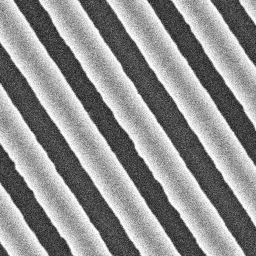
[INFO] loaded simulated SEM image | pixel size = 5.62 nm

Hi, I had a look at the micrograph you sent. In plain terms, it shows lines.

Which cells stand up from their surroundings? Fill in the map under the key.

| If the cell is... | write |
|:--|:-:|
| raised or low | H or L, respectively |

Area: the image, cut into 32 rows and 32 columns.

HHLLLHHHHHLLLLHHHHHLLLHHHHHLLLHH
HHHLLLHHHHHLLLHHHHHLLLLHHHHLLLLH
HHHLLLLHHHHLLLLHHHHHLLLHHHHHLLLL
HHHHLLLHHHHHLLLLHHHHHLLLHHHHHLLL
HHHHHLLLHHHHHLLLHHHHHLLLHHHHHLLL
HHHHHLLLHHHHHLLLLHHHHHLLLHHHHHLL
LHHHHHLLLHHHHHLLLLHHHHLLLLHHHHHL
LLHHHHHLLLHHHHHLLLHHHHHLLLHHHHHL
LLHHHHHLLLHHHHHLLLLHHHHHLLLHHHHH
LLLHHHHHLLLHHHHHLLLLHHHHLLLLHHHH
LLLLHHHHHLLLHHHHHLLLHHHHHLLLHHHH
HLLLHHHHHLLLHHHHHLLLLHHHHHLLLHHH
HLLLLHHHHHLLLHHHHHLLLLHHHHHLLLHH
HHLLLLHHHHLLLLHHHHHLLLHHHHHLLLHH
HHHLLLHHHHHLLLHHHHHLLLLHHHHHLLLH
HHHLLLLHHHHHLLLHHHHHLLLLHHHHLLLL
HHHHLLLLHHHHLLLLHHHHHLLLHHHHHLLL
HHHHHLLLHHHHHLLLLHHHHLLLLHHHHHLL
HHHHHLLLLHHHHHLLLHHHHHLLLLHHHHLL
LHHHHHLLLLHHHHLLLLHHHHLLLLHHHHHL
LLHHHHHLLLHHHHHLLLHHHHHLLLLHHHHH
LLHHHHHLLLLHHHHHLLLHHHHHLLLLHHHH
LLLHHHHHLLLLHHHHLLLLHHHHLLLLHHHH
LLLLHHHHHLLLHHHHHLLLHHHHHLLLLHHH
HLLLHHHHHLLLLHHHHHLLLHHHHHLLLLHH
HHLLLHHHHHLLLHHHHHLLLHHHHHLLLLHH
HHHLLLHHHHHLLLHHHHHLLLHHHHHLLLLH
HHHLLLHHHHHLLLLHHHHHLLLHHHHHLLLL
HHHHLLLHHHHHLLLHHHHHLLLLHHHHLLLL
HHHHLLLLHHHHHLLLHHHHHLLLHHHHHLLL
HHHHHLLLHHHHHLLLLHHHHHLLLHHHHHLL
LHHHHHLLLHHHHHLLLHHHHHLLLLHHHHLL